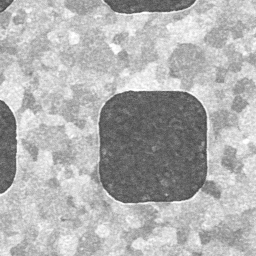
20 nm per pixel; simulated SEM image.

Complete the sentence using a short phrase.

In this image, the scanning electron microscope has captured holes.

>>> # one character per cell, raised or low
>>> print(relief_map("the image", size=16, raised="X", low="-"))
XXXXXXX-----XXXX
XXXXXXXXXXXXXXXX
XXXXXXXXXXXXXXXX
XXXXXXXXXXXXXXXX
XXXXXXXXXXXXXXXX
XXXXXXXXXXXXXXXX
XXXXXXX------XXX
-XXXXX-------XXX
-XXXXX-------XXX
-XXXXX-------XXX
-XXXXX-------XXX
-XXXXX-------XXX
XXXXXXX-----XXXX
XXXXXXXXXXXXXXXX
XXXXXXXXXXXXXXXX
XXXXXXXXXXXXXXXX